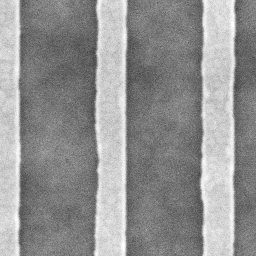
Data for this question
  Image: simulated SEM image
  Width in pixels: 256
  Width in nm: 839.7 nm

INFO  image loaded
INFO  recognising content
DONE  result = lines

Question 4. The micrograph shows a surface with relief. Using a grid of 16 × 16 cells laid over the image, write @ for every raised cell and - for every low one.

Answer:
@-----@@-----@@-
@-----@@-----@@-
@-----@@-----@@-
@-----@@-----@@-
@-----@@-----@@-
@-----@@-----@@-
@-----@@-----@@-
@-----@@-----@@-
@-----@@-----@@-
@-----@@-----@@-
@-----@@-----@@-
@-----@@-----@@-
@-----@@-----@@-
@-----@@-----@@-
@-----@@-----@@-
@-----@@-----@@-